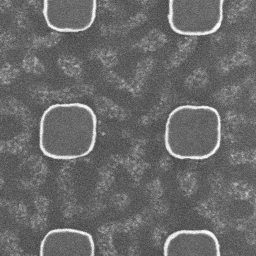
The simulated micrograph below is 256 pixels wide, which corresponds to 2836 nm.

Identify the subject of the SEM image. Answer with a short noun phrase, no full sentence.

raised bodies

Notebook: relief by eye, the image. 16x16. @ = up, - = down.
---@@@-----@@@--
---@@@-----@@@--
----------------
----------------
----------------
----------------
----------------
---@@@-----@@@--
---@@@----@@@@--
---@@------@@---
----------------
----------------
----------------
----------------
---@@------@@---
---@@@----@@@@--